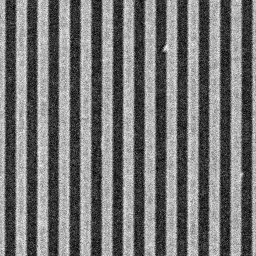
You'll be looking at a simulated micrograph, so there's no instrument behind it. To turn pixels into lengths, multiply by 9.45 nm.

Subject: parallel lines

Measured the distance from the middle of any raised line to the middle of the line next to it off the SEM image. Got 203 nanometers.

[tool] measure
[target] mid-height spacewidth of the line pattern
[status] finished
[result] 120 nm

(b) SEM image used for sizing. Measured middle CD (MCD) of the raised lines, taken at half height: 0.0862 um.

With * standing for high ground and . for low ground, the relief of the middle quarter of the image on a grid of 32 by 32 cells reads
*...***...**...**...**....**...*
*...***...**...**...**....**...*
*...***...**...**...**....**...*
*...***...**...**...**....**...*
*...***...**...**...**....**...*
*...***...**...**...**....**...*
*...***...**...**...**....**...*
*...***...**...**...**....**...*
*...***...**...**...**....**...*
*...**....**...**...**....**...*
*...**....**...**...**....**...*
*...**....**...**...**....**...*
*...**....**...**...**....**...*
*...**....**...**...**....**...*
*...**....**...**...**....**...*
*...**....**...**...**....**...*
*...**....**...**...**....**...*
*...**....**...**...**....**...*
*...**...***...**...**....**...*
*...**...***...**...**....**...*
*...**...***...**...**....**...*
*...**...***...**...**....**...*
*...**....**...**...**....**...*
*...**....**...**...**....**...*
*...**....**...**...**....**...*
*...**....**...**...**....**...*
*...**....**...**...**....**...*
*...**....**...**...**....**...*
*...**....**...**...**....**...*
*...**....**...**...**....**...*
*...**....**...**...**....**...*
*...**....**...**...**....**...*